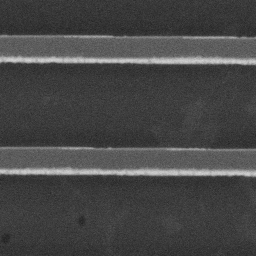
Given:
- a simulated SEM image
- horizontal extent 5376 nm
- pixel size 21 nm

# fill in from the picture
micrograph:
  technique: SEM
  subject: lines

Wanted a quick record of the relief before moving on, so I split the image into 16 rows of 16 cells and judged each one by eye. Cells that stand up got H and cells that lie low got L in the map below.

LLLLLLLLLLLLLLLL
LLLLLLLLLLLLLLLL
HHHHHHHHHHHHHHHH
HHHHHHHHHHHHHHHH
LLLLLLLLLLLLLLLL
LLLLLLLLLLLLLLLL
LLLLLLLLLLLLLLLL
LLLLLLLLLLLLLLLL
LLLLLLLLLLLLLLLL
HHHHHHHHHHHHHHHH
HHHHHHHHHHHHHHHH
LLLLLLLLLLLLLLLL
LLLLLLLLLLLLLLLL
LLLLLLLLLLLLLLLL
LLLLLLLLLLLLLLLL
LLLLLLLLLLLLLLLL